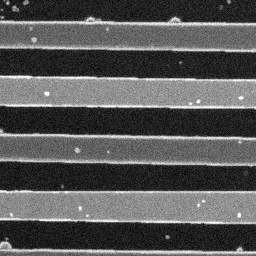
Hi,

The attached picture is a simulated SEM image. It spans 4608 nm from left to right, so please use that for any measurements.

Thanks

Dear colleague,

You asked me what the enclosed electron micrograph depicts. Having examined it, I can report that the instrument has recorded lines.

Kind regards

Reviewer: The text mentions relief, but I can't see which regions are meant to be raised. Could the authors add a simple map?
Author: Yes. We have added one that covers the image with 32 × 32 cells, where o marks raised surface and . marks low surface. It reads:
................................
................................
................................
oooooooooooooooooooooooooooooooo
oooooooooooooooooooooooooooooooo
oooooooooooooooooooooooooooooooo
................................
................................
................................
................................
oooooooooooooooooooooooooooooooo
oooooooooooooooooooooooooooooooo
oooooooooooooooooooooooooooooooo
................................
................................
................................
................................
oooooooooooooooooooooooooooooooo
oooooooooooooooooooooooooooooooo
oooooooooooooooooooooooooooooooo
.....................ooooooooooo
................................
................................
................................
oooooooooooooooooooooooooooooooo
oooooooooooooooooooooooooooooooo
oooooooooooooooooooooooooooooooo
.....ooooooooooooooooooooooooooo
................................
................................
................................
oooooooooooooooooooo...o........